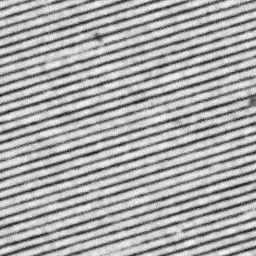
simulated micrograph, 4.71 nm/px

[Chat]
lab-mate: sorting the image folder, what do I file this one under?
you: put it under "parallel lines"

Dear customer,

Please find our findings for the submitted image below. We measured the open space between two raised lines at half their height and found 12.4 nm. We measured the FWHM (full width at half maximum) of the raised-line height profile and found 33.2 nm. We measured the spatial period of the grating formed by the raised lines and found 43 nanometres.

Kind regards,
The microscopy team